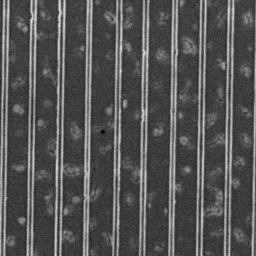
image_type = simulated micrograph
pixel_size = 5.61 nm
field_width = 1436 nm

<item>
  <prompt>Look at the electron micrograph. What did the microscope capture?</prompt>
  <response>parallel lines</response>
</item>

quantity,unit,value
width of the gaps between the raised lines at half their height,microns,0.13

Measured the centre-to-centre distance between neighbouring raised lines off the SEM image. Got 158 nm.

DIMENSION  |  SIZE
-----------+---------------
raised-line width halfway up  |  25.9 nanometres